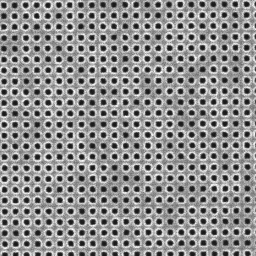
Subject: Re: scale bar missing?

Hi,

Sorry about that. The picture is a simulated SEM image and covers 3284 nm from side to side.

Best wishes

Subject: a regular array of holes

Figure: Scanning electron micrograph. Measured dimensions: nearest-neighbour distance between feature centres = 136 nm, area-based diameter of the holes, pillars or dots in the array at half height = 79.3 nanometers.